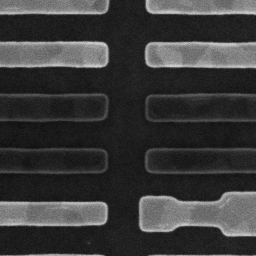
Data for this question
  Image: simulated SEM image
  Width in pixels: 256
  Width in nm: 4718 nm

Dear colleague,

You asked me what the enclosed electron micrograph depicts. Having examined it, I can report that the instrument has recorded wiring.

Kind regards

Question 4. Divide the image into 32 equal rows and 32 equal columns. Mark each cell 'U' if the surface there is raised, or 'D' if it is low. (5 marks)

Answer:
UUUUUUUUUUUUUUDDDDUUUUUUUUUUUUUU
UUUUUUUUUUUUUDDDDDDUUUUUUUUUUUUU
DDDDDDDDDDDDDDDDDDDDDDDDDDDDDDDD
DDDDDDDDDDDDDDDDDDDDDDDDDDDDDDDD
DDDDDDDDDDDDDDDDDDDDDDDDDDDDDDDD
UUUUUUUUUUUUUDDDDDDUUUUUUUUUUUUU
UUUUUUUUUUUUUDDDDDUUUUUUUUUUUUUU
UUUUUUUUUUUUUDDDDDUUUUUUUUUUUUUU
DDDDDDDDDDDDDDDDDDDDDDDDDDDDDDDD
DDDDDDDDDDDDDDDDDDDDDDDDDDDDDDDD
DDDDDDDDDDDDDDDDDDDDDDDDDDDDDDDD
DDDDDDDDDDDDDDDDDDDDDDDDDDDDDDDD
UUUUUUUUUUUUUDDDDDUUUUUUUUUUUUUU
UUUUUUUUUUUUUDDDDDUUUUUUUUUUUUUU
UUUUUUUUUUUUUDDDDDUUUUUUUUUUUUUU
DDDDDDDDDDDDDDDDDDDDDDDDDDDDDDDD
DDDDDDDDDDDDDDDDDDDDDDDDDDDDDDDD
DDDDDDDDDDDDDDDDDDDDDDDDDDDDDDDD
DDDDDDDDDDDDDDDDDDDDDDDDDDDDDDDD
UUUUUUUUUUUUUDDDDDUUUUUUUUUUUUUU
UUUUUUUUUUUUUDDDDDUUUUUUUUUUUUUU
UUUUUUUUUUUUDDDDDDDUUUUUUUUUUDDU
DDDDDDDDDDDDDDDDDDDDDDDDDDDDDDDD
DDDDDDDDDDDDDDDDDDDDDDDDDDDDDDDD
DDDDDDDDDDDDDDDDDDDDDDDDDDDDUUUU
UUUUUUUUUUUUUDDDDUUUUUUUUUUUUUUU
UUUUUUUUUUUUUDDDDUUUUUUUUUUUUUUU
UUUUUUUUUUUUUDDDDUUUUUUUUUUUUUUU
DDDDDDDDDDDDDDDDDDUUUUDDDDDUUUUU
DDDDDDDDDDDDDDDDDDDDDDDDDDDDDDDD
DDDDDDDDDDDDDDDDDDDDDDDDDDDDDDDD
DDDDDDDDDDDDDDDDDDDDDDDDDDDDDDDD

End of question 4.